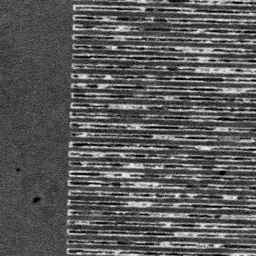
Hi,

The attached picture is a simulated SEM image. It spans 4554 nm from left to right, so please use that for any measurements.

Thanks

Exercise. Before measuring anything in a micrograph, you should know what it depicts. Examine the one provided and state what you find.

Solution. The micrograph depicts parallel lines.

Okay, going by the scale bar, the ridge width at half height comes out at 0.0778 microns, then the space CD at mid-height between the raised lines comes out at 91.1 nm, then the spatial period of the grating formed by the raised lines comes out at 0.174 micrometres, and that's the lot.